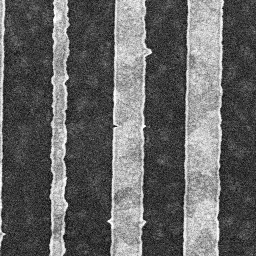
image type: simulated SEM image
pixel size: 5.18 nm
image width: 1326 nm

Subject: one or a few lines or trenches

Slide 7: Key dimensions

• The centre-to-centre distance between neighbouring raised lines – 0.373 microns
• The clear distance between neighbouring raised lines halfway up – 252 nanometers